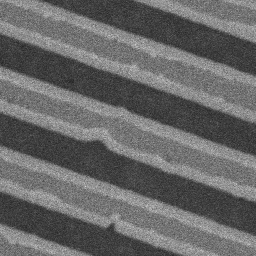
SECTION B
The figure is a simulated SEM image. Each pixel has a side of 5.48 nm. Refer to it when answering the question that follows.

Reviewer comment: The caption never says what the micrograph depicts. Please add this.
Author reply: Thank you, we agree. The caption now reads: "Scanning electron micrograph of one or a few lines or trenches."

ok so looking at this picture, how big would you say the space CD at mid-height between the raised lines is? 227 nm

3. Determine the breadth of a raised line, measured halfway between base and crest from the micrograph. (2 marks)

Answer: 181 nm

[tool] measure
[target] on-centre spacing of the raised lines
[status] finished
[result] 409 nm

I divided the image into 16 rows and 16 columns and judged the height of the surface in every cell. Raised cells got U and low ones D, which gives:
UUUDDDDDDDDUUUUU
UUUUUUDDDDDDDDUU
DDUUUUUUDDDDDDDD
DDDDDUUUUUUDDDDD
DDDDDDDDUUUUUUDD
UUUDDDDDDDDUUUUU
UUUUUUDDDDDDDUUU
DDUUUUUUDDDDDDDD
DDDDDDUUUUUDDDDD
DDDDDDDDUUUUUUDD
UUUDDDDDDDDUUUUU
UUUUUUDDDDDDDDUU
DDDUUUUUUDDDDDDD
DDDDDUUUUUUDDDDD
UDDDDDDDUUUUUUDD
UUUDDDDDDDDUUUUU